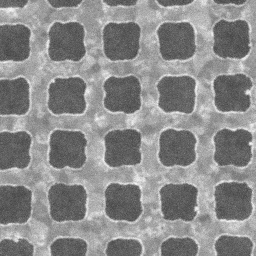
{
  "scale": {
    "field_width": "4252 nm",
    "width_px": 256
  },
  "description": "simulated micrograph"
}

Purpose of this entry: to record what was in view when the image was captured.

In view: a regular array of holes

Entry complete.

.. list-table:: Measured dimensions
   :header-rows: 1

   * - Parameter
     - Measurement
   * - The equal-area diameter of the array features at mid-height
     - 41.5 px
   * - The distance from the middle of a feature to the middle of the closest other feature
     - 0.888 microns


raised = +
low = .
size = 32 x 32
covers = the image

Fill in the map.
...+++....+++....+++....+++...++
++++++++++++++++++++++++++++++++
+++++++++++++++++++++++++++++.++
....++.....++.....++....+++....+
....++.....++.....++.....++....+
....++.....++....+++.....++....+
....++.....++....+++....+++....+
...++++...++++..+++++..+++++++++
++++++++++++++++++++++++++++++++
++++++++++++++++.++++...+++....+
....++.....++.....++.....++.....
....++.....++.....++.....++....+
....++.....++.....++.....++....+
....++.....++.....++....+++....+
++.+++++++++++++++++++++++++++++
++++++++++++++++++++++++++++++++
...++++...++++...+++....+++....+
....++.....++.....++.....++.....
....++.....++.....++.....++.....
....++.....++.....++.....++.....
....++.....++....+++....+++....+
++++++++++++++++++++++++++++++++
++++++++++++++++++++++++++++++++
....++.....++.....++.....++....+
....++.....++.....++.....++.....
....++.....++.....++.....++.....
....++.....++.....++.....++.....
....+++...++++...++++...++++...+
++++++++++++++++++++.+++++++++++
++++++++++++++++++++++++++++..++
....++.....++.....++.....++.....
....++.....++.....++.....++.....